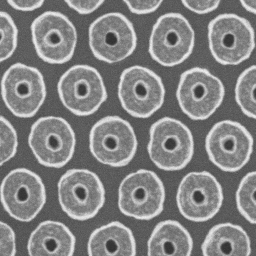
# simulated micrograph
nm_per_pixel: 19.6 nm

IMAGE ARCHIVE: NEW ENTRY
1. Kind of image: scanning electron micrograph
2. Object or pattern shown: a regular array of ring-shaped raised bodies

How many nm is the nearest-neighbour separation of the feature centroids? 1130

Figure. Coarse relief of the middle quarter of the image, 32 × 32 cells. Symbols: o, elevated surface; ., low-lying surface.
................................
.oooooo.........ooooo...........
.oooooooo......ooooooo........oo
ooooooooo......oooooooo.......oo
ooooooooo.....oooooooooo.....ooo
ooo...oooo....oooo..oooo.....ooo
ooo...oooo....oooo...oooo....ooo
ooo...oooo....oooo...oooo....ooo
oooooooooo....ooooooooooo....ooo
ooooooooo......oooooooooo....ooo
oooooooo.......ooooooooo.....ooo
..ooooo.........ooooooo.......oo
.................oooo..........o
................................
.........oooooo.........ooooo...
o.......oooooooo.......ooooooo..
oo.....oooooooooo.....ooooooooo.
oo.....ooooooooooo....ooooooooo.
oo.....ooo...ooooo....oooo..oooo
oo.....ooo...ooooo....ooo...oooo
oo.....ooo...ooooo....ooo...oooo
oo.....ooooooooooo....oooo.ooooo
oo.....oooooooooo.....oooooooooo
o.......oooooooo......ooooooooo.
o........oooooo........oooooooo.
........................oooooo..
................................
.oooooo...........oooo.........o
oooooooo........ooooooo.......oo
ooooooooo......ooooooooo.....ooo
ooo.ooooo.....oooooooooo.....ooo
oo...oooo.....oooo..ooooo....ooo